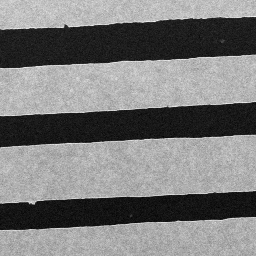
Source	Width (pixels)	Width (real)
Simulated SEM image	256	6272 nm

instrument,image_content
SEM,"one or a few lines or trenches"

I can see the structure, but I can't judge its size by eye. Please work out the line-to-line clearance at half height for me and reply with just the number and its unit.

771 nm